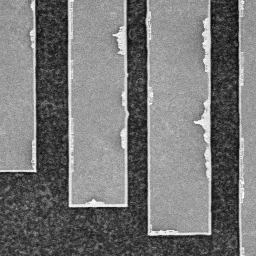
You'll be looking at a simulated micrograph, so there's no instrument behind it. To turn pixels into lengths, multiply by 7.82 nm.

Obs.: one or a few lines or trenches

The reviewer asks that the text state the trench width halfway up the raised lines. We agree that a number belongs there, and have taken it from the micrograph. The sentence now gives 233 nm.